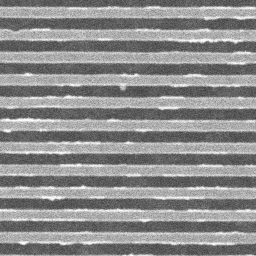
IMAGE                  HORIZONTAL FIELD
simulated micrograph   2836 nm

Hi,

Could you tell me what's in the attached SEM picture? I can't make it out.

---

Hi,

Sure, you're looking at parallel lines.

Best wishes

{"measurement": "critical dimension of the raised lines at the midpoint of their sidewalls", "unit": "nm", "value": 115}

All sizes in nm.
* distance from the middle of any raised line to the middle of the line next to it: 250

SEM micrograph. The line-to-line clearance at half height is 133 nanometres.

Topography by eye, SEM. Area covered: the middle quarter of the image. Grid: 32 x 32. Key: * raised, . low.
................................
................................
................................
********************************
********************************
...........................*.*..
................................
................................
*************.......***.******..
********************************
********************************
................................
................................
................................
********************************
********************************
..................***.........**
................................
................................
...*............................
********************************
********************************
................................
................................
................................
**********...***................
********************************
********************************
................................
................................
................................
********************************